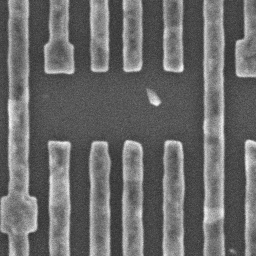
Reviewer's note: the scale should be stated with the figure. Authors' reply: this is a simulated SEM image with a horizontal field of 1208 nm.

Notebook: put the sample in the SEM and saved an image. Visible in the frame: wiring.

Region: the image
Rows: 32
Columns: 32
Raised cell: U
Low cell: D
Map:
DUUDDDUUUDDUUDDDUUDDDUUDDDUUDDDU
DUUDDDUUUDDUUUDDUUDDDUUDDDUUDDDU
DUUDDDUUUDDUUUDDUUDDDUUDDDUUDDDU
DUUDDDUUDDDUUDDDUUDDDUUDDDUUDDDU
DUUDDDUUDDDUUUDDUUDDDUUDDDUUDDDU
DUUDDDUUUDDUUDDDUUDDDUUDDDUUDDUU
DUUDDDUUUDDUUUDDUUDDDUUDDDUUDDUU
DUUUDDUUUDDUUUDDUUDDDUUDDDUUDDUU
DUUUDDUUUDDDUDDDUDDDDUUDDDUUDDUU
DUUUDDDDDDDDDDDDDDDDDDDDDDUUDDUU
DUUDDDDDDDDDDDDDDDDDDDDDDDUUDDDD
DUUUDDDDDDDDDDDDDDDDDDDDDDUUDDDD
DUUUDDDDDDDDDDDDDDDUDDDDDDUUDDDD
DUUUDDDDDDDDDDDDDDDDDDDDDDUUDDDD
DUUUDDDDDDDDDDDDDDDDDDDDDDUUDDDD
DUUUDDDDDDDDDDDDDDDDDDDDDDUUDDDD
DUUUDDDDDDDDDDDDDDDDDDDDDDUUDDDD
DUUUDDDDDDDDDDDDDDDDDDDDDDUUDDDD
DUUUDDUUUDDUUDDDUUDDDUUDDDUUDDDU
DUUUDDUUUDDUUUDUUUDDDUUDDDUUDDDU
DUUUDDUUUDDUUUDDUUDDDUUDDDUUDDDU
DUUUDDUUUDDUUUDDUUDDDUUDDDUUDDDU
DUUUDDUUUDDUUUDDUUDDDUUDDDUUDDDU
DUUDDDUUUDDUUUDDUUDDDUUDDDUUDDDU
DUUUDDUUUDDUUUDUUUDDDUUDDDUUDDDU
UUUUUDUUUDDUUUDUUUDDDUUDDDUUDDDU
UUUUUDUUUDDUUUDUUUDDDUUDDDUUDDDU
UUUUDDUUUDDUUUDUUUDDDUUDDDUUDDDU
UUUUDDUUUDDUUUDUUUDDDUUDDDUUDDDU
DUUUDDUUUDDUUUDUUUDDDUUDDDUUDDDU
DUUUDDUUUDDUUUDUUUDDDUUDDDUUDDDU
DUUUDDUUUDDUUUDDUUDDDUUDDDUUDDDU